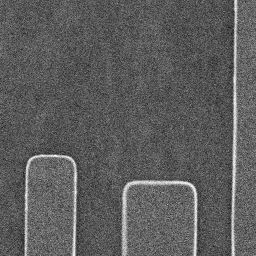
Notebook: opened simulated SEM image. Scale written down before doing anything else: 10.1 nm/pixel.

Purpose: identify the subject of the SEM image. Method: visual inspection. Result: groups of lines, slits or small figures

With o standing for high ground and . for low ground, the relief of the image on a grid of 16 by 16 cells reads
...............o
...............o
...............o
...............o
...............o
...............o
...............o
...............o
...............o
...............o
..ooo..........o
..ooo...oooo...o
..ooo...oooo...o
..ooo...oooo...o
..ooo...oooo...o
..ooo...oooo...o